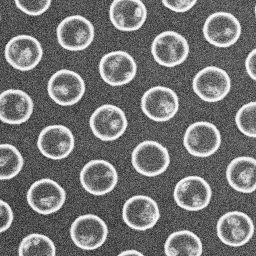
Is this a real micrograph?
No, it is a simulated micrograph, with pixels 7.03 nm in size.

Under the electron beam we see a regular array of raised bodies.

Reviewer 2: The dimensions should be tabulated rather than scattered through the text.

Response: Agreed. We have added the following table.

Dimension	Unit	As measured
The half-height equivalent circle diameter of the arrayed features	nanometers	233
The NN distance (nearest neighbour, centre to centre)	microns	0.386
